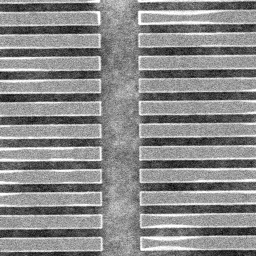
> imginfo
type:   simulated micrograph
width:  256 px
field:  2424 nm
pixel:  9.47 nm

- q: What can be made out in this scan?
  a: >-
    groups of lines, slits or small figures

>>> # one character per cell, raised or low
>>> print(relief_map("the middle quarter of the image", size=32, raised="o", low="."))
ooooooooo..........ooooooooooooo
oooooooo........................
................................
................................
ooooooooo..........ooooooooooooo
ooooooooo..........ooooooooooooo
ooooooooo..........ooooooooooooo
................................
................................
...................ooooooooooooo
ooooooooo..........ooooooooooooo
ooooooooo..........ooooooooooooo
ooooooooo..........ooooooooooooo
................................
................................
ooooooooo..........ooooooooooooo
ooooooooo..........ooooooooooooo
ooooooooo..........ooooooooooooo
................................
................................
................................
ooooooooo..........ooooooooooooo
ooooooooo..........ooooooooooooo
ooooooooo..........ooooooooooooo
................................
................................
...................ooooooooooooo
ooooooooo..........ooooooooooooo
ooooooooo..........ooooooooooooo
ooooooooo..........oooo.........
................................
................................